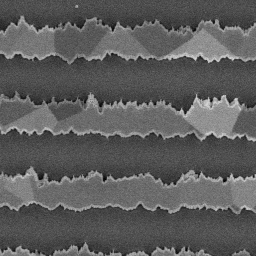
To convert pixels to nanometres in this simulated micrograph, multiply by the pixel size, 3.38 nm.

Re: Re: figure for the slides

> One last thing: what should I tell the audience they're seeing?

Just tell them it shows lines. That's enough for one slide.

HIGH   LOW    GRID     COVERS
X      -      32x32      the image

--------------------------------
--------------------------------
-----------X--------------------
-XXX-XXXXXXXXXXX-XXXX----XXXXX-X
XXXXXXXXXXXXXXXXXXXXXXXXXXXXXXXX
XXXXXXXXXXXXXXXXXXXXXXXXXXXXXXXX
XXXXXXXXXXXXXXXXXXXXXXXXXXXXXXXX
--------X-----------------X---X-
--------------------------------
--------------------------------
--------------------------------
--------------------------------
XXXX-------X---------------X----
XXXXXXXXXXXXXXXXXXXXXX--XXXXXXX-
XXXXXXXXXXXXXXXXXXXXXXXXXXXXXXXX
XXXXXXXXXXXXXXXXXXXXXXXXXXXXXXXX
X-XXX-XXXXXXXXXXXXXXXXXXXXXXXXXX
-------------------------------X
--------------------------------
--------------------------------
--------------------------------
---X----------------------------
XXXXXX--XXXXXXXXXXXX--XXXXXXXXXX
XXXXXXXXXXXXXXXXXXXXXXXXXXXXXXXX
XXXXXXXXXXXXXXXXXXXXXXXXXXXXXXXX
XXXX-XXXXXXXXXXXXXXXXXXXXXXXXXXX
---------------------X-------X--
--------------------------------
--------------------------------
--------------------------------
--------------------------------
XXXX---XXXX--------XXXXX------X-